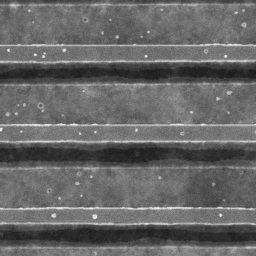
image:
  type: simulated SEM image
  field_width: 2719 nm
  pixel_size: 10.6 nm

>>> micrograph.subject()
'lines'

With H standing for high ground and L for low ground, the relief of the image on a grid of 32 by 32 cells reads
HHHHHHHHHHHHHHHHHHHHHHHHHHHHHHHH
HHHHHHHHHHHHHHHHHHHHHHHHHHHHHHHH
HHHHHHHHHHHHHHHHHHHHHHHHHHHHHHHH
HHHHHHHHHHHHHHHHHHHHHHHHHHHHHHHH
HHHHHHHHHHHHHHHHHHHHHHHHHHHHHHHH
HHHHHHHHHHHHHHHHHHHHHHHHHHHHHHHH
HHHHHHHHHHHHHHHHHHHHHHHHHHHHHHHH
HHHHHHHHHHHHHHHHHHHHHHHHHHHHHHHH
LLLLLLLLLLLLLLLLLLLLLLLLLLLLLLLL
LLLLLLLLLLLLLLLLLLLLLLLLLLLLLLLL
LHLLHHHHHHHHHHHHHHHHHHHHHHHHHHHH
HHHHHHHHHHHHHHHHHHHHHHHHHHHHHHHH
HHHHHHHHHHHHHHHHHHHHHHHHHHHHHHHH
HHHHHHHHHHHHHHHHHHHHHHHHHHHHHHHH
HHHHHHHHHHHHHHHHHHHHHHHHHHHHHHHH
HHHHHHHHHHHHHHHHHHHHHHHHHHHHHHHH
HHHHHHHHHHHHHHHHHHHHHHHHHHHHHHHH
HHHHHHHHHHHHHHHHHHHHHHHHHHHHHHHH
LLLLLLLLLLLLLLLLLLLLLLLLLLLLLLLL
LLLLLLLLLLLLLLLLLLLLLLLLLLLLLLLL
LLLLLLLLLLLLLLLLLLLLLLLLLLLLLLLL
HHHHHHHHHHHHHHHHHHHHHHHHHHHHHHHH
HHHHHHHHHHHHHHHHHHHHHHHHHHHHHHHH
HHHHHHHHHHHHHHHHHHHHHHHHHHHHHHHH
HHHHHHHHHHHHHHHHHHHHHHHHHHHHHHHH
HHHHHHHHHHHHHHHHHHHHHHHHHHHHHHHH
HHHHHHHHHHHHHHHHHHHHHHHHHHHHHHHH
HHHHHHHHHHHHHHHHHHHHHHHHHHHHHHHH
LLLLLLLLLLLLLLLLLLLLLLLLLLLLLLLL
LLLLLLLLLLLLLLLLLLLLLLLLLLLLLLLL
LLLLLLLLLLLLLLLLLLLLLLLLLLLLLLLL
HHHHHHHHHHHHHHHHHHHHHHHHHHHHHHHH